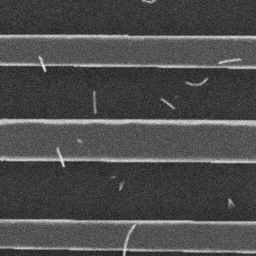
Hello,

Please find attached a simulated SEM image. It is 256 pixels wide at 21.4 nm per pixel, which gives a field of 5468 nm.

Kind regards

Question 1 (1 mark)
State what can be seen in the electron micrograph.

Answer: lines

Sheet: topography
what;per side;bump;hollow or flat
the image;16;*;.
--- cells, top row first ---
................
................
****************
****************
................
................
................
................
****************
****************
................
................
................
................
****************
.***************